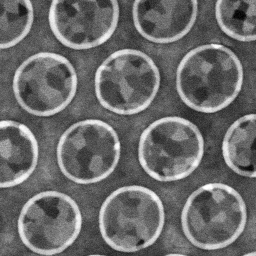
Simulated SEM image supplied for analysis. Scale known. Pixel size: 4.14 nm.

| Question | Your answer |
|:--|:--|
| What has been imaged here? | a regular array of raised bodies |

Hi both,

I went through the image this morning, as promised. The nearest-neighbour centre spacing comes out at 332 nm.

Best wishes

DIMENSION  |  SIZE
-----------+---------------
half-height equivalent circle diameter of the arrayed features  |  0.254 um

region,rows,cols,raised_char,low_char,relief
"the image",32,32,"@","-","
@@@@---@@@@@@@---@@@@@@@---@@@@@
@@@@---@@@@@@@@--@@@@@@@---@@@@@
@@@@--@@@@@@@@---@@@@@@@---@@@@@
@@@----@@@@@@@---@@@@@@@----@@@@
@@@----@@@@@@-----@@@@-------@@@
@@------@@@@--------------------
----------------@-------@@@@@---
----@@@@------@@@@@----@@@@@@@--
---@@@@@@----@@@@@@---@@@@@@@@--
--@@@@@@@---@@@@@@@@--@@@@@@@@--
--@@@@@@@---@@@@@@@@--@@@@@@@@--
--@@@@@@@---@@@@@@@----@@@@@@@--
--@@@@@@@----@@@@@@----@@@@@@---
---@@@@@------@@@@------@@@-----
--------------------------------
@@--------@@@------@@@@@------@@
@@@-----@@@@@@----@@@@@@@----@@@
@@@@----@@@@@@@---@@@@@@@---@@@@
@@@@---@@@@@@@@---@@@@@@@---@@@@
@@@@---@@@@@@@@---@@@@@@@---@@@@
@@@@----@@@@@@----@@@@@@@----@@@
@@@@----@@@@@@-----@@@@@------@@
@@--------@@--------------------
----------------@--------@@@----
-----@@@------@@@@@-----@@@@@@--
----@@@@@----@@@@@@@---@@@@@@@--
---@@@@@@@---@@@@@@@---@@@@@@@--
---@@@@@@@---@@@@@@@---@@@@@@@--
---@@@@@@@---@@@@@@@---@@@@@@@--
---@@@@@@----@@@@@@@----@@@@@---
---@@@@@------@@@@-------@@@----
-----@--------------------------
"